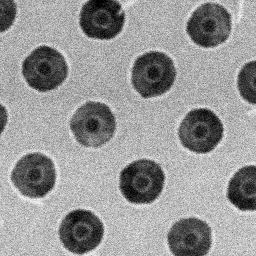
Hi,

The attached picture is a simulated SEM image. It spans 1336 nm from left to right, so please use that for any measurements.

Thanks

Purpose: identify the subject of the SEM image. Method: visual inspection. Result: ring-shaped grooves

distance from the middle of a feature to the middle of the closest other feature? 385 nm